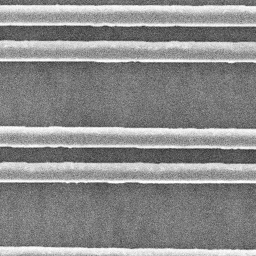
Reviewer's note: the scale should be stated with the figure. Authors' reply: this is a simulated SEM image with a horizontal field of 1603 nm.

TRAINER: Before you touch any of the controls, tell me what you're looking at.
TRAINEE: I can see lines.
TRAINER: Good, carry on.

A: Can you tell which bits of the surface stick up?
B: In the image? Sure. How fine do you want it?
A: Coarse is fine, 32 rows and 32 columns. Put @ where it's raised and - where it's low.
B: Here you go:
--------------------------------
@@@@@@@@@@@@@@@@@@@@@@@@@@@@@@@@
@@@@@@@@@@@@@@@@@@@@@@@@@@@@@@@@
--------------------------------
--------------------------------
@@@@@@@@@@@@@@@@@@---@@---------
@@@@@@@@@@@@@@@@@@@@@@@@@@@@@@@@
@@@@@@@@@@@@@@@@@@@@@@@@@@@@@@@@
--------------------------------
--------------------------------
--------------------------------
--------------------------------
--------------------------------
--------------------------------
--------------------------------
--------------------------------
@@@@@@@@@@@@@@@@@@@@@@@@@@@@@@@@
@@@@@@@@@@@@@@@@@@@@@@@@@@@@@@@@
---------------------------@@@@@
--------------------------------
--------------------------------
@@@@@@@@@@@@@@@@@@@@@@@@@@@@@@@@
@@@@@@@@@@@@@@@@@@@@@@@@@@@@@@@@
--------------------------------
--------------------------------
--------------------------------
--------------------------------
--------------------------------
--------------------------------
--------------------------------
--------------------------------
@@@@@@@@@@@@@@@@@@@@@@@@@@--@@--